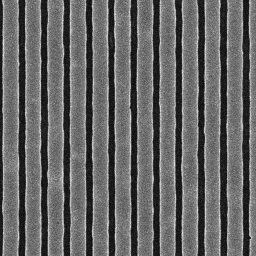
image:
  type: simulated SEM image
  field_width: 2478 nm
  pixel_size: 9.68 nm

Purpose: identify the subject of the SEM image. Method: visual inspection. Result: parallel lines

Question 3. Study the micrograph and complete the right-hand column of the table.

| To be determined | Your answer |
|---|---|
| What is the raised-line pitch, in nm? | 217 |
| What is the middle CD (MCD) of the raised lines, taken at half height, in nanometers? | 151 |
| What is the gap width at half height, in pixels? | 7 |